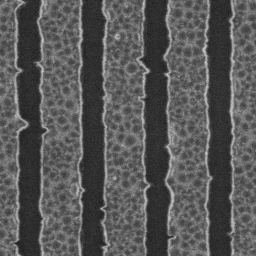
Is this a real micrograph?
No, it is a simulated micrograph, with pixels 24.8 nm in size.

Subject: parallel lines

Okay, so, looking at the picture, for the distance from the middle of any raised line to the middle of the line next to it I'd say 1580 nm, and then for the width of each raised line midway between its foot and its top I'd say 974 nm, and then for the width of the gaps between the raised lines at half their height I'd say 599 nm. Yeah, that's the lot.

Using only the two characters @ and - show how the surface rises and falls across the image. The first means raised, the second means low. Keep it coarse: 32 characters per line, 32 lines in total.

@@@--@@@@@---@@@@@---@@@@@---@@@
@@---@@@@@---@@@@@---@@@@@---@@@
@@---@@@@@---@@@@@---@@@@@---@@@
@@---@@@@@---@@@@@---@@@@@---@@@
@@---@@@@@---@@@@@---@@@@@---@@@
@@---@@@@@---@@@@@---@@@@@---@@@
@@---@@@@@---@@@@@---@@@@@---@@@
@@---@@@@@---@@@@@---@@@@@---@@@
@@---@@@@@---@@@@@---@@@@@---@@@
@@---@@@@@---@@@@@---@@@@@---@@@
@@---@@@@@---@@@@@---@@@@@---@@@
@@---@@@@@---@@@@@---@@@@@---@@@
@@---@@@@@---@@@@@---@@@@@---@@@
@@---@@@@@---@@@@@---@@@@@---@@@
@@---@@@@@---@@@@@---@@@@@---@@@
@@@--@@@@@---@@@@@---@@@@@---@@@
@@----@@@@---@@@@@---@@@@@---@@@
@@---@@@@@---@@@@@---@@@@@---@@@
@@---@@@@@---@@@@@---@@@@@---@@@
@@---@@@@@---@@@@@---@@@@@---@@@
@@---@@@@@---@@@@@---@@@@@---@@@
@@---@@@@@---@@@@@---@@@@@---@@@
@@---@@@@@---@@@@@---@@@@@---@@@
@@---@@@@@---@@@@@---@@@@@---@@@
@@---@@@@@---@@@@@----@@@@---@@@
@@---@@@@@---@@@@@---@@@@@---@@@
@@---@@@@@---@@@@@---@@@@@---@@@
@@---@@@@@---@@@@@---@@@@@---@@@
@@---@@@@@---@@@@@---@@@@@---@@@
@@---@@@@@---@@@@@---@@@@@---@@@
@@---@@@@@---@@@@@---@@@@@---@@@
@@---@@@@@---@@@@@---@@@@@---@@@